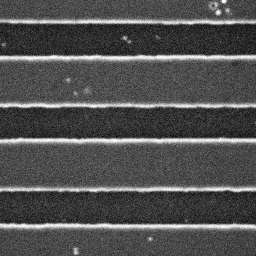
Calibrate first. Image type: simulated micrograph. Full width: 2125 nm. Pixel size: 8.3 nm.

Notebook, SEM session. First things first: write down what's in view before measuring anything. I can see lines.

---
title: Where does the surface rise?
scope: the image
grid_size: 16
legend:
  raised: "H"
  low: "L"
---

HHHHHHHHHHHHHHHH
LLLLLLLLLLLLLLLL
LLLLLLLLLLLLLLLL
LLLLLLLLLLLLLLLL
HHHHHHHHHHHHHHHH
HHHHHHHHHHHHHHHH
HHHHHHHHHHHHHHHH
LLLLLLLLLLLLLLLL
LLLLLLLLLLLLLLLL
HHHHHHHHHHHHHHHH
HHHHHHHHHHHHHHHH
HHHHHHHHHHHHHHHH
LLLLLLLLLLLLLLLL
LLLLLLLLLLLLLLLL
HHHHHHHHHHHHHHHH
HHHHHHHHHHHHHHHH